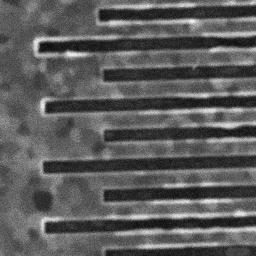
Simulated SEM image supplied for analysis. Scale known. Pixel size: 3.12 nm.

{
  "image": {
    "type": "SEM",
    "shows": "parallel lines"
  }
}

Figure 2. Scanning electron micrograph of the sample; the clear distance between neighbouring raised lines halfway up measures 41.3 nm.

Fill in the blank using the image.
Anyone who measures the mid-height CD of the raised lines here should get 54.5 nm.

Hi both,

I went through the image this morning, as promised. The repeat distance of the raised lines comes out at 93.3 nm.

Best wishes